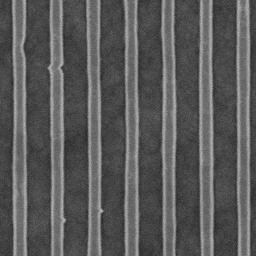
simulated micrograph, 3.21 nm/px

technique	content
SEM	parallel lines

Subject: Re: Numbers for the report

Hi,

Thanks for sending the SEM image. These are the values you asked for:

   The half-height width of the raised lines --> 32.9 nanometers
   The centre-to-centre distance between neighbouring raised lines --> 120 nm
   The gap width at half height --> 0.087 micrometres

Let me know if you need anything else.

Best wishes